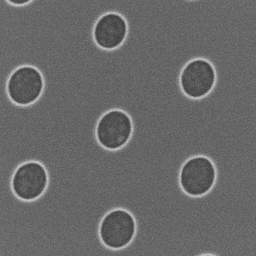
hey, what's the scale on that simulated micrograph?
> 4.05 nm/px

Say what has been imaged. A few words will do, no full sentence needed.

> holes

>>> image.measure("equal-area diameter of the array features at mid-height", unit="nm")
146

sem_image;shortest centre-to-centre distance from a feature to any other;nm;388